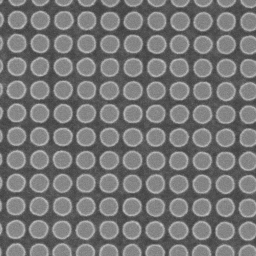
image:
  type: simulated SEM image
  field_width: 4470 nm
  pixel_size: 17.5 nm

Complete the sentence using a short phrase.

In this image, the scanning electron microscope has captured a regular array of raised bodies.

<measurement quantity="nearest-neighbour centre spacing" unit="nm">402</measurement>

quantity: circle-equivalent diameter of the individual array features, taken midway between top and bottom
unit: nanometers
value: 318